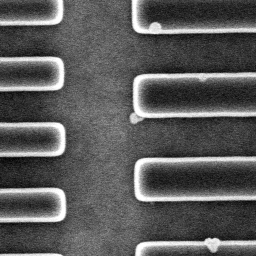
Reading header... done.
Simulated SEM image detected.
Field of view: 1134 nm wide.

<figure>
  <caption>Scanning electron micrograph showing groups of lines, slits or small figures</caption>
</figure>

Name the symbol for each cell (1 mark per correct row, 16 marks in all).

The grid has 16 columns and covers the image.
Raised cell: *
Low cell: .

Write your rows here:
****....********
........********
................
................
****............
***.....********
........********
................
****............
****............
.........*******
.........*******
****............
****............
................
.........*******